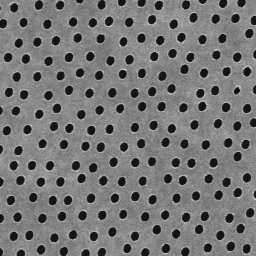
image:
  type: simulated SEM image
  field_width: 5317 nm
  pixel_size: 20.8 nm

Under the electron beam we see a regular array of holes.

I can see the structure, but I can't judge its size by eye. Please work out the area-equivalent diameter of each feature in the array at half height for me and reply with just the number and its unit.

0.183 microns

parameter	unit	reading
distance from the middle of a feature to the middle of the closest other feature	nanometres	362